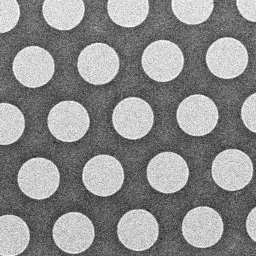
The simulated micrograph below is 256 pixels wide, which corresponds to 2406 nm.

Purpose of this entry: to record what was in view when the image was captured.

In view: an array of small figures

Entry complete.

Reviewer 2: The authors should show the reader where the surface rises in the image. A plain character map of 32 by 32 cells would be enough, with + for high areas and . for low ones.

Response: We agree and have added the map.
++....++++....++++....+++++...++
++...+++++....++++....++++....++
++....++++....++++.....+++.....+
++.....++.......................
................................
............+......+++.....+++..
...+++....++++....+++++...+++++.
..+++++...+++++...+++++...+++++.
..+++++...+++++...+++++...+++++.
..++++....++++.....+++.....++...
...+++..........................
................................
...............+++.....+++.....+
++.....+++....+++++...+++++...++
+++...+++++...+++++...+++++...++
+++...+++++...+++++...+++++....+
+++...+++++....+++.....+++......
++......++......................
................................
............++......++.....++++.
...++++....++++....++++....++++.
..+++++...+++++...+++++....+++++
..+++++...+++++....++++....++++.
...++++....++++....++++.....++..
....++..........................
................................
................++......+++....+
+++....++++....++++....+++++...+
+++....+++++...+++++...+++++...+
++++...+++++...+++++...+++++...+
+++....++++....++++.....+++.....
+++.....++......................